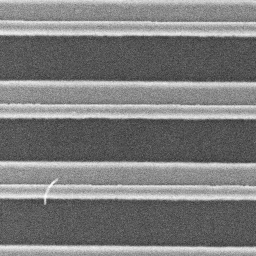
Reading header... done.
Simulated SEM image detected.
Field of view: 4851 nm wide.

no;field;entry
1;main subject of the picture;lines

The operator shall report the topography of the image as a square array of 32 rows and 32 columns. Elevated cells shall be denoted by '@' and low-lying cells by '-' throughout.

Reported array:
@@@@@@@@@@@@@@@@@@@@@@@@@@@@@@@@
@@@@@@@@@@@@@@@@@@@@@@@@@@@@@@@@
@@@@@@@@@@@@@@@@@@@@@@@@@@@@@@@@
@@@@@@@@@@@@@@@@@@@@@@@@@@@@@@@@
--------------------------------
--------------------------------
--------------------------------
--------------------------------
--------------------------------
--------------------------------
@@@@@@@@@@@@@@@@@@@@@-@@--------
@@@@@@@@@@@@@@@@@@@@@@@@@@@@@@@@
@@@@@@@@@@@@@@@@@@@@@@@@@@@@@@@@
@@@@@@@@@@@@@@@@@@@@@@@@@@@@@@@@
-----@@@@@@@@@@@@@@@@@@@@@@@@@@@
--------------------------------
--------------------------------
--------------------------------
--------------------------------
--------------------------------
@@@@@-@-------------------------
@@@@@@@@@@@@@@@@@@@@@@@@@@@@@@@@
@@@@@@@@@@@@@@@@@@@@@@@@@@@@@@@@
@@@@@@@@@@@@@@@@@@@@@@@@@@@@@@@@
@@@@@@@@@@@@@@@@@@@@@@@@@@@@@@@@
--------------------------------
--------------------------------
--------------------------------
--------------------------------
--------------------------------
--------------------------------
@@@@@@@@@@@@@@@@@@@@@@@@@@@@@@@@